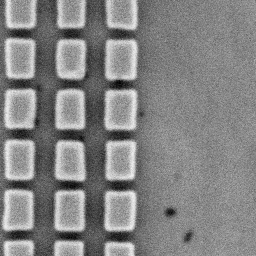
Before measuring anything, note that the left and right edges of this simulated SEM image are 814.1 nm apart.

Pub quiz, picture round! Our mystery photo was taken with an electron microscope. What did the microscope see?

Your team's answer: wiring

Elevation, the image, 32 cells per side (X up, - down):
-XXX---XXXX--XXXX---------------
-XXX---XXXX--XXXX---------------
-XXX---XXX----XXX---------------
---------------XX---------------
--------------------------------
-XXX---XXXX--XXXX---------------
-XXX---XXXX--XXXX---------------
-XXX---XXXX--XXXX---------------
-XXX---XXXX--XXXX---------------
-XXX----XX---XXXX---------------
--------------------------------
-XXX----XX----XXX---------------
-XXX---XXX---XXXX---------------
-XXX---XXX---XXXX---------------
-XXX---XXX---XXXX---------------
-XXX---XXX---XXXX---------------
--------------------------------
--------------------------------
-XXX---XXX---XXXX---------------
-XXX---XXX---XXXX---------------
-XXX---XXX---XXXX---------------
-XXX---XXXX--XXXX---------------
---------X----------------------
--------------------------------
-XXX---XXX---XXXX---------------
-XXX---XXX---XXXX---------------
-XXX---XXX---XXXX---------------
-XXX---XXX---XXXX---------------
-XXX---XXX---XXX----------------
--------------------------------
-XXX---XXX---XXX----------------
-XXX---XXX---XXXX---------------